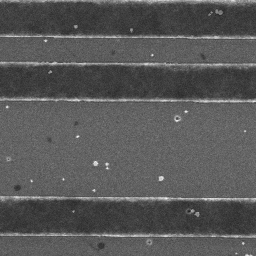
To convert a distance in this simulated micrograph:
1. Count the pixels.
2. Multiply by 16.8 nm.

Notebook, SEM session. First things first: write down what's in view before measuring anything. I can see lines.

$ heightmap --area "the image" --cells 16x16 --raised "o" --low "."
oooooooooooooooo
oooooooooooooooo
................
................
oooooooooooooooo
oooooooooooooooo
................
................
................
................
................
................
oooooooooooooooo
oooooooooooooooo
oooooooooooooooo
................